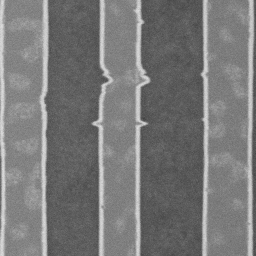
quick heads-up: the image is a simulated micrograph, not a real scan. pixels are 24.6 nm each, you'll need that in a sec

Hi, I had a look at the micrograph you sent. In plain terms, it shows one or a few lines or trenches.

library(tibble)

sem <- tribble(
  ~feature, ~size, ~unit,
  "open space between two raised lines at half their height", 1.52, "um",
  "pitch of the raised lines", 2.51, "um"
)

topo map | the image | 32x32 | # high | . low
######.......####.........#####.
######.......####.........#####.
######.......####.........#####.
######.......####.........#####.
######.......####.........#####.
######.......####.........#####.
######.......####.........#####.
######.......####.........#####.
######.......#####........#####.
######........####........#####.
######.......#####........#####.
######.......####.........#####.
#####........####.........#####.
#####........####.........#####.
#####........####.........#####.
#####.......######........#####.
#####........####.........#####.
#####........####.........#####.
#####........####.........#####.
#####........####.........#####.
#####........####.........#####.
#####........####.........#####.
#####........####.........#####.
#####........####.........#####.
#####........####.........#####.
#####........####.........#####.
#####........####.........#####.
#####........####.........#####.
#####........####.........#####.
#####........####.........#####.
#####........####.........#####.
#####........####.........#####.